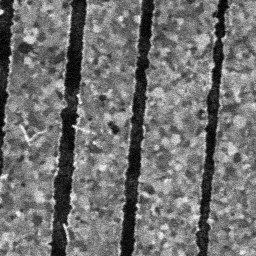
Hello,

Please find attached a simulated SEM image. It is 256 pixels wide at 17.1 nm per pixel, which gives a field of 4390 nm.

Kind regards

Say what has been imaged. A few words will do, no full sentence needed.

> one or a few lines or trenches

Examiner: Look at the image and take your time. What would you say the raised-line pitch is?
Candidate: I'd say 1220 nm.